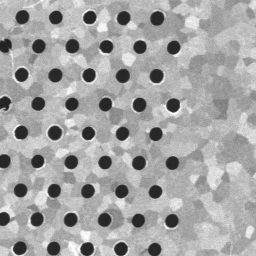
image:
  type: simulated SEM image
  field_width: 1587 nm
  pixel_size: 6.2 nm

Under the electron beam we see a regular array of holes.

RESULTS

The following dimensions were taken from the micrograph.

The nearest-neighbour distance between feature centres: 0.206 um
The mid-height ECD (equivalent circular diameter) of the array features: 83.6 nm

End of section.